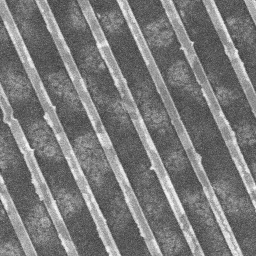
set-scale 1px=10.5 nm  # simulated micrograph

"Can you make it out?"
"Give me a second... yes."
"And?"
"parallel lines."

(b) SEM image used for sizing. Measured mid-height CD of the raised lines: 94.7 nm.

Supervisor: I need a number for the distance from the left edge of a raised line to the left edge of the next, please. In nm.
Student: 400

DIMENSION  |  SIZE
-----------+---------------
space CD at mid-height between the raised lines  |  306 nm